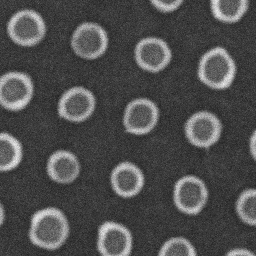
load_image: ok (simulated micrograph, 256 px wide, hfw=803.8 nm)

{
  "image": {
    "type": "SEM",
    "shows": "a regular array of raised bodies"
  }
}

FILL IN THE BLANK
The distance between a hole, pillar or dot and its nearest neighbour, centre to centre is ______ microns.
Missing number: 0.199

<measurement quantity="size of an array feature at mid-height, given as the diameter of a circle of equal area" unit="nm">110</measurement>